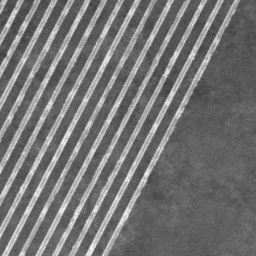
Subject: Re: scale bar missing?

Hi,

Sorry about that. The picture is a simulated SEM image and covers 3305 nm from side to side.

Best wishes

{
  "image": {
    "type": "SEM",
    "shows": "parallel lines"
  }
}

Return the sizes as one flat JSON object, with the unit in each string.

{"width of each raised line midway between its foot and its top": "50.1 nm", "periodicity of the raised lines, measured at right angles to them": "14.8 pixels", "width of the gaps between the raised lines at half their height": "136 nanometers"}